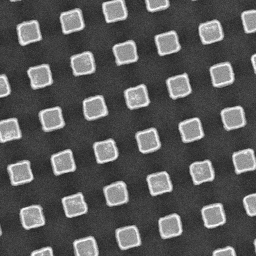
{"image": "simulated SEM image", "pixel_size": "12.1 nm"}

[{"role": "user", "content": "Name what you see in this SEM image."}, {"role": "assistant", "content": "a regular array of raised bodies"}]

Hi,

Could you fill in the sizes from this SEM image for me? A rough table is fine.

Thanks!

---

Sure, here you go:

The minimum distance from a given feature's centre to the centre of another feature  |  0.529 micrometres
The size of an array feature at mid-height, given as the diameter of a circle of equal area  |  0.279 µm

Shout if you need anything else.